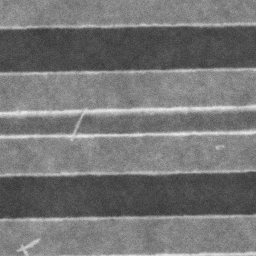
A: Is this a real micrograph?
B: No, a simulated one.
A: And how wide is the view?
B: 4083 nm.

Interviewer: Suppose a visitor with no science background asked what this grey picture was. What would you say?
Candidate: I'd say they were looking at lines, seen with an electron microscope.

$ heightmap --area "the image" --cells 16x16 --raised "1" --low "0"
1111111111111111
1111111111111110
0000000000000000
0000000000000000
0000000011111111
1111111111111111
1111111111111111
1111111111111111
1111111111111111
1111111111111111
1111111111111111
0000000000000000
0000000000000000
0000000000000000
1111111111111111
1111111111111111